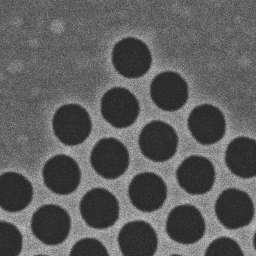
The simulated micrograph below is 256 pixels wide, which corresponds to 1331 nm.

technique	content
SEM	a regular array of holes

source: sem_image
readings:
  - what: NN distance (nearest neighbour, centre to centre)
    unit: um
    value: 0.263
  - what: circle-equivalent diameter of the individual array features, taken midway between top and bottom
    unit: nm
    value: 209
